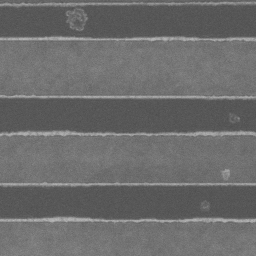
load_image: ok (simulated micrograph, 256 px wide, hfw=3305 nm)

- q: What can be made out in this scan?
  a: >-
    lines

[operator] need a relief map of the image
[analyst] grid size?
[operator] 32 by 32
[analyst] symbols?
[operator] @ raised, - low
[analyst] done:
-@@@@@@@@@@@@@@@@@@@@@@@@@@@@@@@
@@@@@@@@@@@@@@@@@@@@@@@@@@@@@@@@
@@@@@@@@@@@@@@@@@@@@@@@@@@@@@@@@
@@@@@@@@@@@@@@@@@@@@@@@@@@@@@@@@
@@@@@@@@@@@@@@@@@@@@@@@@@@@@@@@@
--------------------------------
--------------------------------
--------------------------------
--------------------------------
--------------------------------
--------------------------------
--------------------------------
@@@@@@@@@@@@@@@@@@@@@@@@@@@@@@@@
@@@@@@@@@@@@@@@@@@@@@@@@@@@@@@@@
@@@@@@@@@@@@@@@@@@@@@@@@@@@@@@@@
@@@@@@@@@@@@@@@@@@@@@@@@@@@@@@@@
@@@@@@@@@@@@@@@@@@@@@@@@@@@@@@@@
--------------------------------
--------------------------------
--------------------------------
--------------------------------
--------------------------------
--------------------------------
@@@@@@@@@@@@@@@@@@@@@@@@@@@@@@@@
@@@@@@@@@@@@@@@@@@@@@@@@@@@@@@@@
@@@@@@@@@@@@@@@@@@@@@@@@@@@@@@@@
@@@@@@@@@@@@@@@@@@@@@@@@@@@@@@@@
-@-@@------@@@@@@@@@@@@@@@@@@@@@
--------------------------------
--------------------------------
--------------------------------
--------------------------------